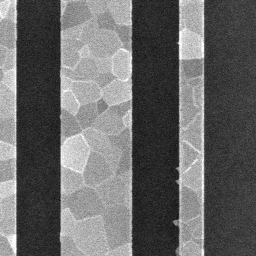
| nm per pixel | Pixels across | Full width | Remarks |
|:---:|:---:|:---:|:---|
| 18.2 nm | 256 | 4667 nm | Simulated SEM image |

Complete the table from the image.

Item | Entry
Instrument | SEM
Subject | lines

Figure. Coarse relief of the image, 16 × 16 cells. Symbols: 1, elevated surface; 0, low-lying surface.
1000111100011000
1000111100011000
1000111100011000
1000111100011000
1000111100011000
1000111100011000
1000111100011000
1000111100011000
1000111100011000
1000111100011000
1000111100011000
1000111100011000
1000111100011000
1000111100011000
1000111100011000
1000111100011000